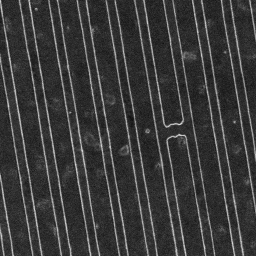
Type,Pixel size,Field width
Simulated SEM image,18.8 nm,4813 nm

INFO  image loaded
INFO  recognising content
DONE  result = parallel lines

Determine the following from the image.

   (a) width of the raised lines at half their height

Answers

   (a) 174 nm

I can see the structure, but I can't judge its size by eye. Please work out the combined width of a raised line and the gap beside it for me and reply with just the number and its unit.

0.534 µm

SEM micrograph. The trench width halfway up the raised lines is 362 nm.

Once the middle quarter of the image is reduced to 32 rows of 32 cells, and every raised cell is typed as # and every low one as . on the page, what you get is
#.....##.....##.....###.....##..
#.....##.....###.....##.....##..
#.....##......##.....##.....##..
#......##.....##.....##.....##..
##.....##.....##.....##.....###.
##.....##.....##.....##.....###.
##.....##.....##.....###.....##.
##.....##.....###.....##.....##.
##.....##.....###.....##.....##.
###.....##.....##.....##.....##.
.##.....##.....##.....##.....###
.##.....##.....##.....##.....###
.##.....##.....###....###.....##
.##.....##......##.....##.....##
.##.....##......##.....##.....##
.###.....##.....##.....##.######
..##.....##.....##.....#########
..##.....##.....##.....#########
..##.##..##.....##.....###....##
..##..#..##......##.....##.....#
..##.....##......##.....##.....#
..##......##..##.##.....##.....#
...##.....##..#..##.....##.....#
...##.....##.....##.....##.....#
...##.....##.....##......##.....
...##.....##.....###.....##.....
...##.....##......##.....##.....
...###....###.....##.....##.....
....##.....##.....##.....##.....
....##.....##.....##.....##.....
....##.....##.....##.....###....
....##.....##.....##......##....